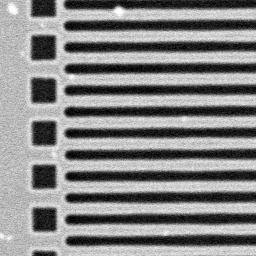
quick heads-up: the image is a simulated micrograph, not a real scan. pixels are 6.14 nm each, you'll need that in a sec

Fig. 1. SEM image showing groups of lines, slits or small figures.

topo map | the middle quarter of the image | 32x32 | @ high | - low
--------------------------------
--------------------------------
--------------------------------
@@@@@@@@@@@@@@@@@@@@@@@@@@@@@@@@
@@@@@@@@@@@@@@@@@@@@@@@@@@@@@@@@
--------------------------------
--------------------------------
--------------------------------
@@@@@@@@@@@@@@@@@@@@@@@@@@@@@@@@
@@@@@@@@@@@@@@@@@@@@@@@@@@@@@@@@
@--@@@@@@@@---------------------
--------------------------------
--------------------------------
@----@@@@@@@@@@@@@@@@------@@@@@
@@@@@@@@@@@@@@@@@@@@@@@@@@@@@@@@
@@@@@@@@@@@@@@@@@@@@@@@@@@@@@@@@
--------------------------------
--------------------------------
--------------------------------
@@@@@@@@@@@@@@@@@@@@@@@@@@@@@@@@
@@@@@@@@@@@@@@@@@@@@@@@@@@@@@@@@
@-------------------------------
--------------------------------
--------------------------------
@@@@@@@@@@@@@@@@@@@@@@@@@@@@@@@@
@@@@@@@@@@@@@@@@@@@@@@@@@@@@@@@@
@@@@@@@@@@@@@@@@@@@@-------@@@@@
--------------------------------
--------------------------------
@-------------------------------
@@@@@@@@@@@@@@@@@@@@@@@@@@@@@@@@
@@@@@@@@@@@@@@@@@@@@@@@@@@@@@@@@